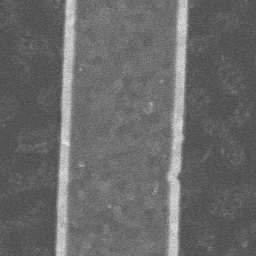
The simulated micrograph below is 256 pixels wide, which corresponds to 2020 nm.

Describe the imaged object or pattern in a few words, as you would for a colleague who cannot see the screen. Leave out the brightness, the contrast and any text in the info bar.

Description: one or a few lines or trenches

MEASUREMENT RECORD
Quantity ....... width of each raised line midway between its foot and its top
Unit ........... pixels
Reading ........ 114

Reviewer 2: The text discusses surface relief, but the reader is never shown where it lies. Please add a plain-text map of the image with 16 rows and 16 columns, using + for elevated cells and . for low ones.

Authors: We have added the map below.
....+++++++.....
....+++++++.....
....+++++++.....
....+++++++.....
....+++++++.....
....+++++++.....
....+++++++.....
....+++++++.....
....+++++++.....
....+++++++.....
....+++++++.....
....+++++++.....
....+++++++.....
....+++++++.....
....+++++++.....
....+++++++.....